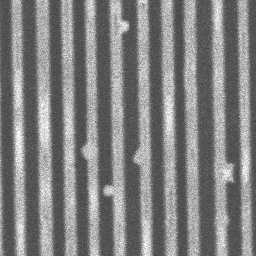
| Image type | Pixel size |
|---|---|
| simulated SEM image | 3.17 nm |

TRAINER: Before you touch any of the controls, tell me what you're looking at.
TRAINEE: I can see parallel lines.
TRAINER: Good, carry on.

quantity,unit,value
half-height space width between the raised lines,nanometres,44.4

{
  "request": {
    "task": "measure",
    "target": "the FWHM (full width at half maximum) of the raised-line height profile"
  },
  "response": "32.9 nm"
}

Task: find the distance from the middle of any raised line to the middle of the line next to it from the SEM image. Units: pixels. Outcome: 25.2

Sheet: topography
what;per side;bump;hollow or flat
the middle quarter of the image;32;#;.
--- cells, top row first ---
##....##....##.....##....##...##
##....##....##.....##....##...##
##....##....##.....##....##...##
##....##....##.....##....##...##
##....##....##.....##....###..##
##....##....##.....##....###..##
##....##....##.....##....###...#
##....##....##.....##....###...#
##....##....##.....##....###...#
##....##....###....##....###...#
##....##....###....##....###..##
##....##....###....##....###...#
##....##....###....##....###..##
##....##....###....##....###..##
##....##....###....##....###...#
##....##....###....##....###...#
##....##....###....##....###...#
##....##....###....##....###...#
###...##....###....##....###...#
###...##....###....##....###...#
###..###....###....##....###...#
###.####....###...###....###...#
###..###....###...###....###...#
###..###....###...####...###...#
###...##....###...####...###...#
##....##....###....###...###...#
###...##....###....###...###...#
###...##....###....###...###...#
###...##....###....###...###...#
###...##....###....###...###...#
###...##....###....###...###...#
###...##..#####....###...###...#